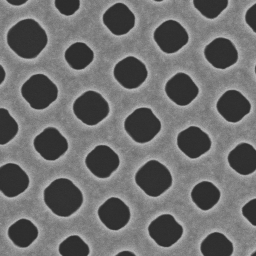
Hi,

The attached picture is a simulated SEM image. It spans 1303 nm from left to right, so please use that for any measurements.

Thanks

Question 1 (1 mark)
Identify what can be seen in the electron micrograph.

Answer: a regular array of holes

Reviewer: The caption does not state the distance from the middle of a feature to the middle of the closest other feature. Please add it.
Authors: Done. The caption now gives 272 nanometers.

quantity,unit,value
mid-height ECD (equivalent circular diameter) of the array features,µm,0.161